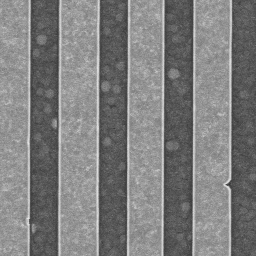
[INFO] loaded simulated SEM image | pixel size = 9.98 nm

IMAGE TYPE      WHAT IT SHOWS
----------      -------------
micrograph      one or a few lines or trenches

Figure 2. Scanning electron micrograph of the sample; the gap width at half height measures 30.5 px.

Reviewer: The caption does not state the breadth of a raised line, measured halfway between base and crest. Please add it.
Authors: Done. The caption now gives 368 nanometres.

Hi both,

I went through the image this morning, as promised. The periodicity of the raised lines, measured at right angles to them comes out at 665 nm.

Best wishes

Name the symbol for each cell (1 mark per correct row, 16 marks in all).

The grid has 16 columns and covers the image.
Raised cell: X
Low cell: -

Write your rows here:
XX--XX--XX--XX--
XX--XX--XX--XX--
XX--XX--XX--XX--
XX--XX--XX--XX--
XX--XX--XX--XX--
XX--XX--XX--XX--
XX--XX--XX--XX--
XX--XX--XX--XX--
XX--XX--XX--XX--
XX--XX--XX--XX--
XX--XX--XX--XX--
XX--XX--XX--XX--
XX--XX--XX--XX--
XX--XX--XX--XX--
XX--XX--XX--XX--
XX--XX--XX--XX--